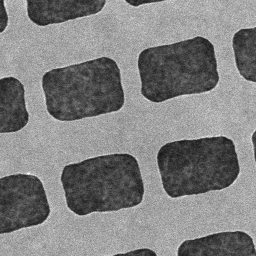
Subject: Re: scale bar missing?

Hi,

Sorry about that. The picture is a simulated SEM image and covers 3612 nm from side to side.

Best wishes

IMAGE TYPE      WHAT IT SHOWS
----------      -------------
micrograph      holes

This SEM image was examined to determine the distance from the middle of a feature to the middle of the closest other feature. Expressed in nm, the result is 1360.